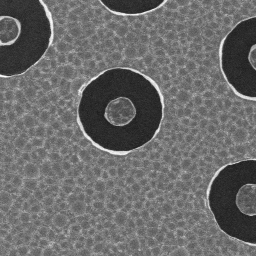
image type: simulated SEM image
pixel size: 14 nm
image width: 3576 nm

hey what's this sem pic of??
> ring-shaped grooves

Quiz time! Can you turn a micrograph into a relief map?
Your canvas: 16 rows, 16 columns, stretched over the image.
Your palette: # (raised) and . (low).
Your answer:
...####...######
#..############.
#..###########..
...###########..
.######..#####..
#####.....#####.
#####..#..######
#####..#..######
#####.....######
################
##############..
#############...
#############..#
#############...
##############..
################